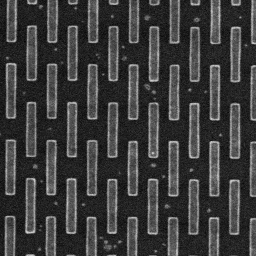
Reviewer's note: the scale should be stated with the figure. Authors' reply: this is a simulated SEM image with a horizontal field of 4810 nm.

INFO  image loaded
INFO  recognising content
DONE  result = groups of lines, slits or small figures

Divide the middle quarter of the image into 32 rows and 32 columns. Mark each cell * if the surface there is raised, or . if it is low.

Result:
.**....*...**....*....**........
.**...**...**...**....**...**...
.**...**...**...**....*....**...
.**...**...**...**...**....**...
......**........**.........*....
......**........**.........*....
......**........**........**....
......**........**........**....
......**........**........**....
......**........**........**....
.**...**...**...**...**...**....
.**...**...**...**...**...***...
.**...**...**...**...***..***...
.**...**...**...**...***..***...
.**........**........**.........
.**........**........**.........
.**........**........**.........
.**........**........**.........
.**........**........**.........
.**...**...**...**...**...**....
.**...**...**...**...**...**...*
.**...**...**...**...**...**...*
.**...**...**...**...**...**....
......**........**........**....
......**........**........**....
......**........**........**....
......**........**........**....
......**........**........**....
......**........**........**....
.**...**...**...**...**...**....
.**...**...**...**...**...**....
.**...**...**...**...**...**...*